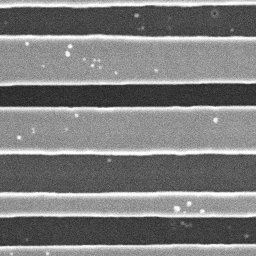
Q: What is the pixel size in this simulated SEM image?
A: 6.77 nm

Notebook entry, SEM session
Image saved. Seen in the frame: lines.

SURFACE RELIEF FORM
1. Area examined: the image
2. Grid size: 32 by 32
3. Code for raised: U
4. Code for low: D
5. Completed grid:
UUUUUUUUUUUUUUUUUUUDUDUUUDDDDDDD
DDDDDDDDDDDDDDDDDDDDDDDDDDDDDDDD
DDDDDDDDDDDDDDDDDDDDDDDDDDDDDDDD
DDDDDDDDDDDDDDDDDDDDDDDDDDDDDDDD
DDDDDDDDDDDDDDDDDDDDDDDDDDDDDDDD
UUUUUUUUUUUUUUUUUUUUUUUUUUUUUUUU
UUUUUUUUUUUUUUUUUUUUUUUUUUUUUUUU
UUUUUUUUUUUUUUUUUUUUUUUUUUUUUUUU
UUUUUUUUUUUUUUUUUUUUUUUUUUUUUUUU
UUUUUUUUUUUUUUUUUUUUUUUUUUUUUUUU
UUDDDDDDDDDDDDDDDDDDDDDDDDDDDDDD
DDDDDDDDDDDDDDDDDDDDDDDDDDDDDDDD
DDDDDDDDDDDDDDDDDDDDDDDDDDDDDDDD
DDDDDDDDDDDDDDDDDDDDDUUUUUUUUUUU
UUUUUUUUUUUUUUUUUUUUUUUUUUUUUUUU
UUUUUUUUUUUUUUUUUUUUUUUUUUUUUUUU
UUUUUUUUUUUUUUUUUUUUUUUUUUUUUUUU
UUUUUUUUUUUUUUUUUUUUUUUUUUUUUUUU
UUUUUUUUUUUUUUUUUUUUUUUUUUUUUUUU
DDDDDDDDDDDDDDDDDDDDDDDDDDDDDDDD
DDDDDDDDDDDDDDDDDDDDDDDDDDDDDDDD
DDDDDDDDDDDDDDDDDDDDDDDDDDDDDDDD
DDDDDDDDDDDDDDDDDDDDDDDDDDDDDDDD
DDDDDDDDDDDDDDDDDDDDDDDDDDDDDDDD
UUUUUUUUUUUUUUUUUUUUUUUUUUUUUUUU
UUUUUUUUUUUUUUUUUUUUUUUUUUUUUUUU
UUUUUUUUUUUUUUUUUUUUUUUUUUUUUUUU
DDDDDDDDDDDDDDDDDDDDDDDDDDDDDDDD
DDDDDDDDDDDDDDDDDDDDDDDDDDDDDDDD
DDDDDDDDDDDDDDDDDDDDDDDDDDDDDDDD
DDDDDDDDDDDDDDDDDDDDDDDDDDDDDDDD
UUUUUUUUUUUUUUUUUUUUUUUUUUUUUUUU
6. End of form